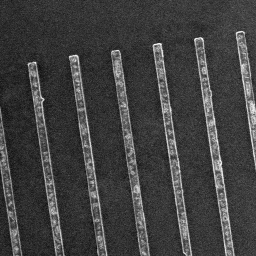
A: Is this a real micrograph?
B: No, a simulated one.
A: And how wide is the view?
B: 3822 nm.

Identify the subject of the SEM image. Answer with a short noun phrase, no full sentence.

parallel lines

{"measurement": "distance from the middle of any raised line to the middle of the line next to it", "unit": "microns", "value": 0.627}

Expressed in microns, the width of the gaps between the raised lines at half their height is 0.508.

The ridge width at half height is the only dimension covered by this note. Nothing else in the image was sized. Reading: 129 nm